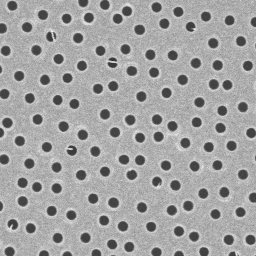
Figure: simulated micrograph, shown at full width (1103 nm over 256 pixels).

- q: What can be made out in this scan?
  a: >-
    a regular array of holes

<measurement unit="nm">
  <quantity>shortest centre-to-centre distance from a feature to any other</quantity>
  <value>86.4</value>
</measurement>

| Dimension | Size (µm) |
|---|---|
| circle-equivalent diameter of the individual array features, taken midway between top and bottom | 0.0407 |